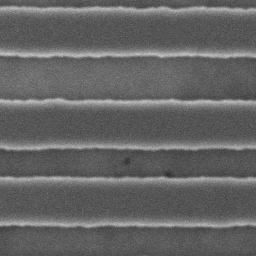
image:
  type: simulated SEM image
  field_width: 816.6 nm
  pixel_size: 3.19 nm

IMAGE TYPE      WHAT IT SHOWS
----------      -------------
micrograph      lines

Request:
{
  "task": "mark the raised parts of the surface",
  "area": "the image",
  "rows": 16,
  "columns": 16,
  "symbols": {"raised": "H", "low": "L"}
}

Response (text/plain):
HHLLLHHHLLLLHLLL
HHHHHHHHHHHHHHHH
HHHHHHHHHHHHHHHH
LLHHHHHLLLHLLHHH
LLLLLLLLLLLLLLLL
LLLLLLLLLLLLLLLL
HHHHHHHHHHHHHHHH
HHHHHHHHHHHHHHHH
HHHHHHHHHHHHHHHH
LLLLLLLLLLLLLLLL
LLLLLLLLLLLLLLLL
HHHHHHHHHHHHHHHH
HHHHHHHHHHHHHHHH
HHHHHHHHHHHHHHHH
LLLLLLLLLLLLLLLL
LLLLLLLLLLLLLLLL